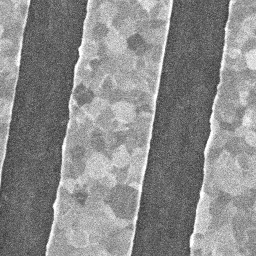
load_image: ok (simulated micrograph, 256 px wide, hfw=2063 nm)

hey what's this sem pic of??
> one or a few lines or trenches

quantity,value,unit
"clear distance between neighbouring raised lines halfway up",466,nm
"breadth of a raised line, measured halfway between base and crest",667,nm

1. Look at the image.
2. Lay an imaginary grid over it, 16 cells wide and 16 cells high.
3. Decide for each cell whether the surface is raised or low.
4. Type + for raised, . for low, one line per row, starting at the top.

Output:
++...++++++...++
++...++++++...++
+....+++++....++
+....+++++....++
+....+++++....++
+....+++++....++
+...++++++...+++
+...++++++...+++
....+++++....+++
....+++++....+++
....+++++....+++
....+++++....+++
....+++++...++++
...++++++...++++
...+++++....++++
...+++++....++++